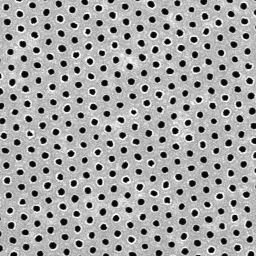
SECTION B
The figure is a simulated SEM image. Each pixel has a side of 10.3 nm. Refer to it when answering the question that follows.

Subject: a regular array of holes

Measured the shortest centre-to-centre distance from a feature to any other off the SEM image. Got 0.151 µm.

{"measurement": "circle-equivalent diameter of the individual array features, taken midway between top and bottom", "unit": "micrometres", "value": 0.0659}